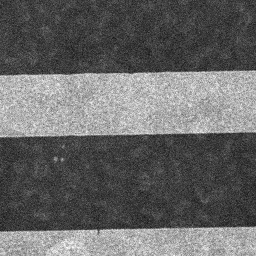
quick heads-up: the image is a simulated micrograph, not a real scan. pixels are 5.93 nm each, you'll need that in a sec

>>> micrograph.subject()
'one or a few lines or trenches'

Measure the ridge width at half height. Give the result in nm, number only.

361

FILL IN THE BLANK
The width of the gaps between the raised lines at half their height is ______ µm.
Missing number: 0.564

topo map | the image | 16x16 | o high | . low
................
................
................
................
..............oo
oooooooooooooooo
oooooooooooooooo
oooooooooooooooo
o...............
................
................
................
................
................
.ooooooooooooooo
oooooooooooooooo